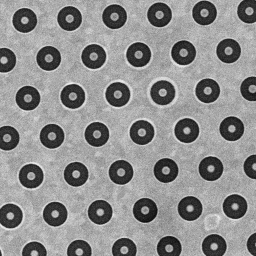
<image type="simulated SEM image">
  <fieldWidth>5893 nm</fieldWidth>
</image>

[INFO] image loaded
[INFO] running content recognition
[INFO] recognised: an array of small figures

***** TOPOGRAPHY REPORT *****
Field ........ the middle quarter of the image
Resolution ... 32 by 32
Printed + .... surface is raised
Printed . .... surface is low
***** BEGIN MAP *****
+++++.....+++++++....++++++++..+
++++++++++++++++++++++++++++++++
++++++++++++++++++++++++++++++++
++++++++++++++++++++++++++++++++
++++++++++++...+++++++.....+++++
....+++++++.....+++++.......++++
.....+++++.......++++...+...++++
..+...++++...+...++++...++..++++
.++...++++...+...++++.......++++
.....++++++.....++++++.....+++++
....++++++++...++++++++...++++++
++.+++++++++++++++++++++++++++++
++++++++++++++++++++++++++++++++
++++++++++++++++++++++++++++++..
+++++++..+++++++++....++++++....
++++++.....++++++......+++++....
+++++......+++++...+...++++...+.
+++++..++...++++...+...++++.....
+++++......++++++.....++++++....
++++++.....+++++++....+++++++...
+++++++..+++++++++++++++++++++++
++++++++++++++++++++++++++++++++
++++++++++++++++++++++++++++++++
+++++++++++++++++++++++++.++++++
++..++++++++....+++++++.....++++
+....++++++......++++++.....++++
......+++++...+..+++++...+...+++
..++..+++++..++..+++++.......+++
......+++++......++++++.....++++
+.....++++++....++++++++...+++++
++..++++++++++++++++++++++++++++
++++++++++++++++++++++++++++++++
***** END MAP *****